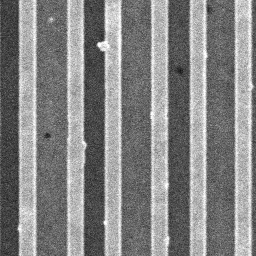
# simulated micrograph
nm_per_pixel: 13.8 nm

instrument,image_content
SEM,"parallel lines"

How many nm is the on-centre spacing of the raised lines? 595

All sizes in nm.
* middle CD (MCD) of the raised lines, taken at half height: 214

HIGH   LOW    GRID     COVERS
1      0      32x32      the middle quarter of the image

01111000001111000000001111000000
01111000001111000000001111000000
01111000001111000000001111000000
01111000001111000000001111000000
01111000001111000000001111000000
01111000001111000000001111000000
01111000000111000000001111000000
01111000000111000000001111000000
01111000000111000000001111000000
01111000000111000000001111000000
01111000000111000000001111000000
01111000000111000000001111000000
01111000001111000000001111000000
01111000001111000000001111000000
01111000001111000000001111000000
01111000001111000000001111000000
01111000001111000000001111000000
01111000001111000000001111000000
01111000001111000000001111000000
01111000001111000000001111000000
01111000001111000000001111000000
01111000001111000000001111000000
01111000001111000000001111000000
01111000001111000000001111000000
01111000001111000000001111000000
01111000001111000000001111000000
01111000001111000000001111000000
01111000001111000000001111000000
01111000001111000000001111000000
01111000001111000000001111000000
01111000001111000000001111000000
01111000001111000000001111000000